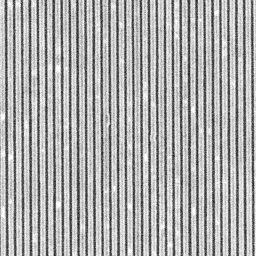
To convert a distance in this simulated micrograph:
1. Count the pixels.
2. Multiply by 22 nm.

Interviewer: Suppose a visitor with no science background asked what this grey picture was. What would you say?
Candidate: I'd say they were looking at parallel lines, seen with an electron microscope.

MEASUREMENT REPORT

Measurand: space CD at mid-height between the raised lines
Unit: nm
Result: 74.3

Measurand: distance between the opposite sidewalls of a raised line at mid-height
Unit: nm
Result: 93.5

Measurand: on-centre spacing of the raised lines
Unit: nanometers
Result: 175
